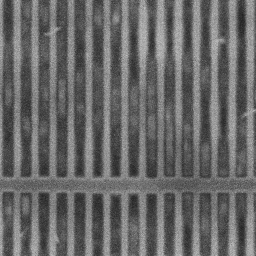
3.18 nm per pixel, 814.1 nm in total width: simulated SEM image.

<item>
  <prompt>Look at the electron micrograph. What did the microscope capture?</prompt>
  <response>parallel lines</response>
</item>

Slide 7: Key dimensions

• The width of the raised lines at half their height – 17.9 nm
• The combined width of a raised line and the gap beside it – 57.1 nanometres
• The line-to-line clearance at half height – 38.6 nm